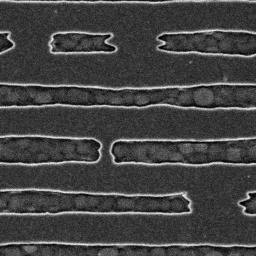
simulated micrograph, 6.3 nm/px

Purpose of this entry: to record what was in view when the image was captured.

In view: parallel lines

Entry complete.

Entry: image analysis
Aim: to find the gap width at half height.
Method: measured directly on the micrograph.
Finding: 127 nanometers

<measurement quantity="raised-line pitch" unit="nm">332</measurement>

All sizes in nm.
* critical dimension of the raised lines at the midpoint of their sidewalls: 205